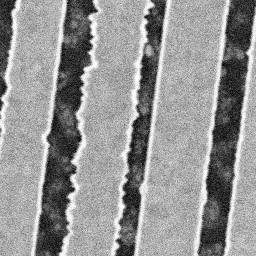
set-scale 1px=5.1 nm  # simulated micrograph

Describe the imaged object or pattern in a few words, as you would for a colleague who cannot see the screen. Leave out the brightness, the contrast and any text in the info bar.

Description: one or a few lines or trenches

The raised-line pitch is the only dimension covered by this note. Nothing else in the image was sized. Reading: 392 nm